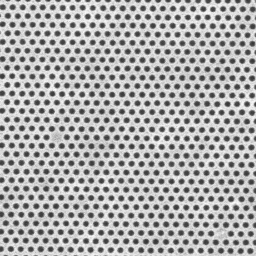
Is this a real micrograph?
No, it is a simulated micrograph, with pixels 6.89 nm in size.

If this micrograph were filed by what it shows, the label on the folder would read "a regular array of holes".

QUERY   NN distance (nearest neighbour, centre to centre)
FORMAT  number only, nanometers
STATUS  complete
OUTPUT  66.5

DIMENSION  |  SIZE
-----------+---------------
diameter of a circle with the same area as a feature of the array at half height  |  6.39 pixels